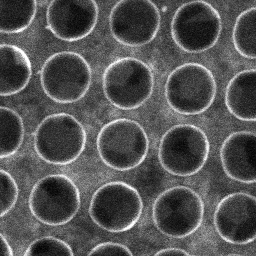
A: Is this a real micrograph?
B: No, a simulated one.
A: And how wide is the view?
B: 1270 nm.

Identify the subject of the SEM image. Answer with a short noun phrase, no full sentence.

a regular array of raised bodies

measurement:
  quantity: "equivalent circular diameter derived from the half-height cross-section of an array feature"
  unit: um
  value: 0.251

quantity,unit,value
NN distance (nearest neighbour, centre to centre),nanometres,304